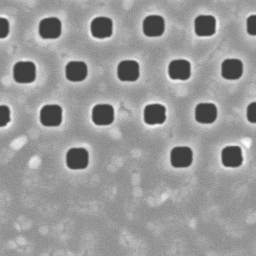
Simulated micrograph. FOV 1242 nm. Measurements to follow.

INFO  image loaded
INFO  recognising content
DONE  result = a regular array of holes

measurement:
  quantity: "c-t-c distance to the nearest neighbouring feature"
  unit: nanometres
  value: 245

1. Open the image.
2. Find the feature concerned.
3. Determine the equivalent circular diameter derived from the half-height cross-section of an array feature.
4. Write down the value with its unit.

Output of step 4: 0.112 microns